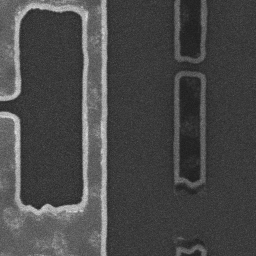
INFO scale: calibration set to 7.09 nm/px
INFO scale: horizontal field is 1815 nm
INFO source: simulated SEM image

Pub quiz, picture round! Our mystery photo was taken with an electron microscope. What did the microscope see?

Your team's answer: one or a few lines or trenches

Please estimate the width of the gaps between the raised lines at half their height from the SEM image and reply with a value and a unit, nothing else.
71.3 px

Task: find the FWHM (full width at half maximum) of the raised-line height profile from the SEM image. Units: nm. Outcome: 148